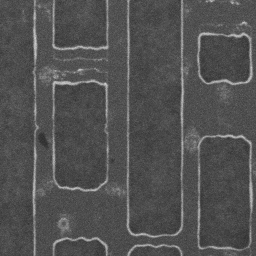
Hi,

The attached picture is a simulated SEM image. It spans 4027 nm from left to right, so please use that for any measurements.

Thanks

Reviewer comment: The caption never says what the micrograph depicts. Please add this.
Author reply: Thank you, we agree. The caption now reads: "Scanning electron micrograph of one or a few lines or trenches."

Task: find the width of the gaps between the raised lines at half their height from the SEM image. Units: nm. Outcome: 837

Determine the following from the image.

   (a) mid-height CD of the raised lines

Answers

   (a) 19.6 pixels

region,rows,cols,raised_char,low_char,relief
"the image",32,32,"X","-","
----XXX------XXX-------XXXXXXXXX
----XXX------XXX-------XXXXXXXXX
----XXX------XXX-------XXXXXXXXX
----XXX------XXX-------XXXXXXXXX
----XXX------XXX-------XX---XX-X
----XXX-------XX-------XX------X
-----XXXXXXXXXXX-------XX------X
----XXXXXXXXXXXX-------XX------X
----XXXXXXXXXXXX-------XX------X
----XXXXXXXXXXXX-------XX------X
----XXX------XXX-------XXXXXXXXX
----XXX------XXX-------XXXXXXXXX
----XXX------XXX-------XXXXXXXXX
----XXX------XXX-------XXXXXXXXX
----XXX------XXX-------XXXXXXXXX
-----XX------XXX-------XXXXXXXXX
----XXX------XXX-------XXXXXXXXX
----XXX------XXX-------XX------X
----XXX------XXX-------XX------X
----XXX------XXX-------XX------X
----XXX------XXX-------XX------X
----XXX------XXX-------XX------X
----XXX------XXX-------XX------X
----XXXX----XXXX-------XX------X
----XXXXXXXXXXXX-------XX------X
----XXXXXXXXXXXX-------XX------X
----XXXXXXXXXXXX-------XX------X
----XXXXXXXXXXXX-------XX------X
----XXXXXXXXXXXX-------XX------X
----XXXXXXXXXXXXXXXXXXXXX------X
----XXX------XXXXXXXXXXXX------X
----XXX------XXX-------XXXXXXXXX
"